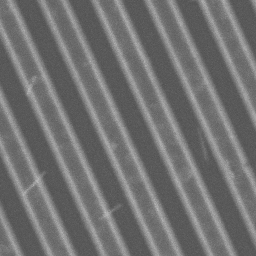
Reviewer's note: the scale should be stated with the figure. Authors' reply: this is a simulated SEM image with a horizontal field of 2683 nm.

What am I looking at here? parallel lines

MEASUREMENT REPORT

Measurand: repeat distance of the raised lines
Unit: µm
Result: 0.51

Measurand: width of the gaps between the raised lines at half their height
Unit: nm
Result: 268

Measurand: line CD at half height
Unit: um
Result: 0.25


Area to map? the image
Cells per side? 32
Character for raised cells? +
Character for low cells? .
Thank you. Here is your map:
++...+++....+++....+++...+++....
++....+++...+++....+++....+++...
+++...+++....+++...++++...+++...
+++....+++...+++....+++....+++..
++++...+++....+++...++++...+++..
.+++....+++...+++....+++...++++.
.+++....+++....+++...++++...+++.
..+++...++++...+++....+++...++++
..+++....+++....+++...+++....+++
...+++...++++...+++....+++...+++
...+++....+++...++++...+++....++
...++++...+++....+++....+++...++
+...+++....+++...+++....+++....+
+...++++...+++....+++...++++...+
+....+++....+++...+++....+++....
++...++++...+++....+++...++++...
++....+++...++++...+++....+++...
+++...+++....+++....+++...+++...
+++....+++...++++...+++....+++..
++++...+++....+++...++++...+++..
.+++....+++...++++...+++....+++.
.++++...+++....+++...++++...+++.
..+++...++++...+++....+++....+++
..+++....+++....+++...+++....+++
...+++...++++...+++....+++...+++
...+++....+++....+++...+++....++
....+++...++++...+++....+++...++
+...+++....+++...++++...+++....+
+...++++...+++....+++....+++...+
++...+++....+++...++++...+++....
++...++++...+++....+++...++++...
++....+++....+++...++++...+++...